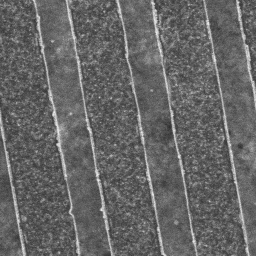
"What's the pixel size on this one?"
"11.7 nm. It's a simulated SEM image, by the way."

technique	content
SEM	one or a few lines or trenches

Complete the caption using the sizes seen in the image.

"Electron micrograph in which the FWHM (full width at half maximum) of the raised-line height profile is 606 nm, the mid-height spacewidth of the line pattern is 366 nanometers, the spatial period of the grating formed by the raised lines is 980 nanometers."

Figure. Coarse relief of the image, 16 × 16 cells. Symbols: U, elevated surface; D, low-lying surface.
UUDDUUUDDDUUUDDU
UUDDUUUUDDUUUDDU
UUUDDUUUDDUUUDDU
UUUDDUUUDDUUUDDU
UUUDDUUUDDUUUUDD
UUUDDUUUDDUUUUDD
UUUDDUUUUDDUUUDD
UUUDDUUUUDDUUUDD
UUUUDDUUUDDUUUDD
UUUUDDUUUDDUUUDD
DUUUDDUUUDDUUUUD
DUUUDDUUUDDDUUUD
DUUUDDUUUUDDUUUD
DUUUUDUUUUDDUUUD
DUUUUDDUUUDDUUUD
DUUUUDDUUUDDUUUD